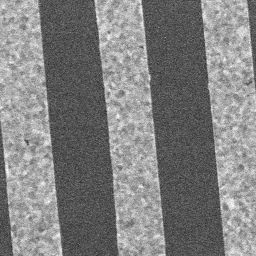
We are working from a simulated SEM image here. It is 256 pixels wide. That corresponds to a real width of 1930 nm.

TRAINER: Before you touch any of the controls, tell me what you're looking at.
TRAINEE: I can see one or a few lines or trenches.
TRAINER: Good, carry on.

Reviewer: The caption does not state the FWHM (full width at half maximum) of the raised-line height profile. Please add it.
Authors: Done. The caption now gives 339 nanometers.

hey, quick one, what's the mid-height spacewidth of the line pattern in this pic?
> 444 nm